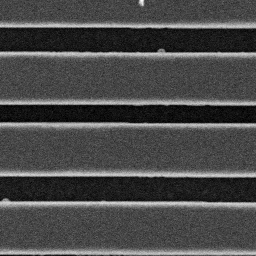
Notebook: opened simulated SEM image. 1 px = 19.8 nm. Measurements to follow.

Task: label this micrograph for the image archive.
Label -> lines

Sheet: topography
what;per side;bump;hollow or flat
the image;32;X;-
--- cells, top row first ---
XXXXXXXXXXXXXXXXXXXXXXXXXXXXXXXX
XXXXXXXXXXXXXXXXXXXXXXXXXXXXXXXX
XXXXXXXXXXXXXXXXXXXXXXXXXXXXXXXX
--------------------------------
--------------------------------
--------------------------------
--------------------------------
XXXXXXXXXXXXXXXXXXXXXXXXXXXXXXXX
XXXXXXXXXXXXXXXXXXXXXXXXXXXXXXXX
XXXXXXXXXXXXXXXXXXXXXXXXXXXXXXXX
XXXXXXXXXXXXXXXXXXXXXXXXXXXXXXXX
XXXXXXXXXXXXXXXXXXXXXXXXXXXXXXXX
XXXXXXXXXXXXXXXXXXXXXXXXXXXXXXXX
--------------------------------
--------------------------------
XXXXXXXXXXXXXXXXXXXXXXXXXXXXXXXX
XXXXXXXXXXXXXXXXXXXXXXXXXXXXXXXX
XXXXXXXXXXXXXXXXXXXXXXXXXXXXXXXX
XXXXXXXXXXXXXXXXXXXXXXXXXXXXXXXX
XXXXXXXXXXXXXXXXXXXXXXXXXXXXXXXX
XXXXXXXXXXXXXXXXXXXXXXXXXXXXXXXX
XXXXXXXXXXXXXXXXXXXXXXXXXXXXXXXX
--------------------------------
--------------------------------
--------------------------------
XXXXXXXXXXXXXXXXXXXXXXXXXXXXXXXX
XXXXXXXXXXXXXXXXXXXXXXXXXXXXXXXX
XXXXXXXXXXXXXXXXXXXXXXXXXXXXXXXX
XXXXXXXXXXXXXXXXXXXXXXXXXXXXXXXX
XXXXXXXXXXXXXXXXXXXXXXXXXXXXXXXX
XXXXXXXXXXXXXXXXXXXXXXXXXXXXXXXX
XXXXXXXXXXXXXXXXXXXXXXXXXXXXXXXX